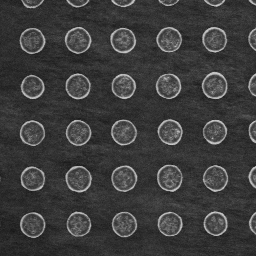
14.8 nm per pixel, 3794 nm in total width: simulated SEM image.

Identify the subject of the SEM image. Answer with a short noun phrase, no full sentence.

a regular array of raised bodies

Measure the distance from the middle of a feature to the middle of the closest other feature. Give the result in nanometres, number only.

673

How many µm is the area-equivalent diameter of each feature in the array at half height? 0.36